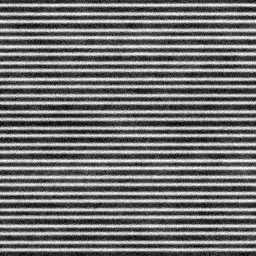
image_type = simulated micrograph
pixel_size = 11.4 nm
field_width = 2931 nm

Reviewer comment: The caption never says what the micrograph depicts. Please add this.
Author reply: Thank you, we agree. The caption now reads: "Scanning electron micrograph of parallel lines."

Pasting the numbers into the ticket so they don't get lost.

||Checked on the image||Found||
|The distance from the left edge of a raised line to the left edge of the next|0.0935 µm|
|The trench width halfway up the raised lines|73.7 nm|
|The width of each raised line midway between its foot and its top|21.5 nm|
